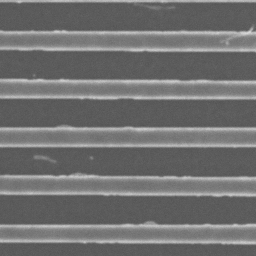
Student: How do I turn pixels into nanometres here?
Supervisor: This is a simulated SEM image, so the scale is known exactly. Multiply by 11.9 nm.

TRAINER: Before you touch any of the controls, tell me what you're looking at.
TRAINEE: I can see lines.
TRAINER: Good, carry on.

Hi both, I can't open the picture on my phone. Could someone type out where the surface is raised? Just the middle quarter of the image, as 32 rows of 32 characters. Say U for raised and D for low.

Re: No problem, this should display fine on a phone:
DDDDDDDDDDDDDDDDDDDDDDDDDDDDDDDD
DDDDDDDDDDDDDDDDDDDDDDDDDDDDDDDD
DDDDDDDDDDDDDDDDDDDDDDDDDDDDDDDD
DDDDDDDDDDDDDDDDDDDDDDDDDDDDDDDD
UUUUUUUUUUUUUUUUUUUUUUUUUUUUUUUU
UUUUUUUUUUUUUUUUUUUUUUUUUUUUUUUU
UUUUUUUUUUUUUUUUUUUUUUUUUUUUUUUU
UUUUUUUUUUUUUUUUUUUUUUUUUUUUUUUU
DDDDUDDDUUUDUUDDDUUUUUUUUUUUUUUU
DDDDDDDDDDDDDDDDDDDDDDDDDDDDDDDD
DDDDDDDDDDDDDDDDDDDDDDDDDDDDDDDD
DDDDDDDDDDDDDDDDDDDDDDDDDDDDDDDD
DDDDDDDDDDDDDDDDDDDDDDDDDDDDDDDD
DDDDDDDDDDDDDDDDDDDDDDDDDDDDDDDD
DDDDDDDDDDDDDDDDDDDDDDDDDDDDDDDD
DDDDDDDDDDDDDDDDDDDDDDDDDDDDDDDD
UUUUUUUUUUUUUUUUUUUUUUUUUUUUUUUU
UUUUUUUUUUUUUUUUUUUUUUUUUUUUUUUU
UUUUUUUUUUUUUUUUUUUUUUUUUUUUUUUU
UUUUUUUUUUUUUUUUUUUUUUUUUUUUUUUU
UUUUUUUUUUUUUUUUUUUUUUUUUUUUUUUU
DDDDDDDDDDDDDDDDDDDDDDDDDDDDDDDD
DDDDDDDDDDDDDDDDDDDDDDDDDDDDDDDD
DDDDDDDDDDDDDDDDDDDDDDDDDDDDDDDD
DDDDDDDDDDDDDDDDDDDDDDDDDDDDDDDD
DDDDDDDDDDDDDDDDDDDDDDDDDDDDDDDD
DDDDDDDDDDDDDDDDDDDDDDDDDDDDDDDD
DDDDDDDDDDDDDDDDDDDDDDDDDDDDDDDD
UUUUUUUUUUUUUUUUUUUUUUUUUUUUUUUU
UUUUUUUUUUUUUUUUUUUUUUUUUUUUUUUU
UUUUUUUUUUUUUUUUUUUUUUUUUUUUUUUU
UUUUUUUUUUUUUUUUUUUUUUUUUUUUUUUU